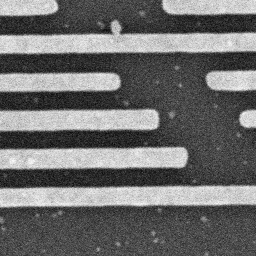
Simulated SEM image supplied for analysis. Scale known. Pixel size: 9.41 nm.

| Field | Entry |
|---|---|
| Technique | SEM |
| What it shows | wiring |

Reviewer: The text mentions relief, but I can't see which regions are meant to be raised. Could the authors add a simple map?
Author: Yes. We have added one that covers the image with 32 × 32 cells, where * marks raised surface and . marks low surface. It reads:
*******.............************
*******..............***********
................................
..............*.................
...*****************************
********************************
*************...................
................................
................................
***************...........******
***************...........******
................................
................................
................................
********************..........**
********************..........**
................................
................................
................................
***********************.........
***********************.........
................................
................................
.............*******************
********************************
****************************....
................................
................................
................................
................................
................................
................................